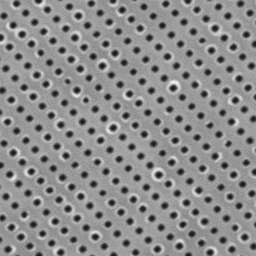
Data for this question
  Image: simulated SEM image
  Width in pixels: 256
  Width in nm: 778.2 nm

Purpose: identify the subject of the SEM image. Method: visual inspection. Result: a regular array of holes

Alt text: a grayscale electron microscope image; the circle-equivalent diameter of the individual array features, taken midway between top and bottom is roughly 0.0214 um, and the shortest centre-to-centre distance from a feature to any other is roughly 39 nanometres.